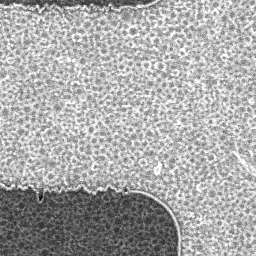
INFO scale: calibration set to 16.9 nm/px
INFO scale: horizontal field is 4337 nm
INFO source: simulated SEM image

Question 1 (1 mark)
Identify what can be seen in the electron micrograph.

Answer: one or a few lines or trenches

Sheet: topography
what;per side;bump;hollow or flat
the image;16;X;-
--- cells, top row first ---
--XX--XX--------
----------------
----------------
----------------
----------------
----------------
----------------
----------------
----------------
----------------
----------------
----------------
XXXXXXXXXX------
XXXXXXXXXXX-----
XXXXXXXXXXX-----
XXXXXXXXXXX-----